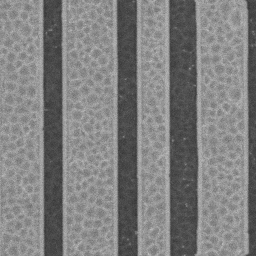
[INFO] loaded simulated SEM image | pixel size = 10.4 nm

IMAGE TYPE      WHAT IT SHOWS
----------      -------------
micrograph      one or a few lines or trenches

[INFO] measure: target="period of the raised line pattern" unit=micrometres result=0.692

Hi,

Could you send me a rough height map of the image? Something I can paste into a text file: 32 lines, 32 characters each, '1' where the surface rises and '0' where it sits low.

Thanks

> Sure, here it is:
11111000111111000111100001111110
11111000111111000111100001111110
11111000111111000111100001111110
11111000111111000111100001111110
11111000111111000111100001111110
11111000111111000111100001111110
11111000111111000111100001111110
11111000111111000111100001111110
11111000111111000111100001111110
11111000111111100111100001111110
11111000111111000111100001111110
11111000111111000111100001111110
11111000111111000111100001111110
11111000111111000111100001111110
11111000111111000111100001111110
11111000111111000111100001111110
11111000111111000111100001111110
11111000111111000111100001111110
11111000111111000111100001111110
11111000111111000111100001111110
11111000111111000111100001111110
11111000111111000111100001111110
11111000111111000111100001111110
11111000111111000011100001111110
11111000111111000011100001111110
11111000111111000011100001111110
11111000111111000011100001111110
11111000111111000011100001111110
11111000111111000011100001111110
11111000111111000011100001111110
11111000111111000011100001111110
11111000111111000011100001111110